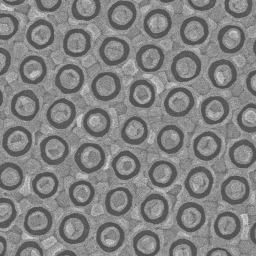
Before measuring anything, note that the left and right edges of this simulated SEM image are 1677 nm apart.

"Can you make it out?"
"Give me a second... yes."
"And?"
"a regular array of ring-shaped grooves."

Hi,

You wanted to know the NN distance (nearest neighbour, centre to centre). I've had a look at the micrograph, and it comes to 0.235 micrometres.